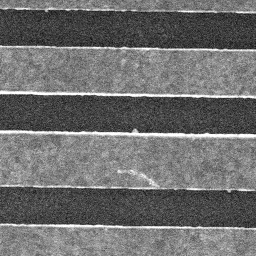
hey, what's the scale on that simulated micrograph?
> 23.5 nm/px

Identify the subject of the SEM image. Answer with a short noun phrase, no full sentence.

lines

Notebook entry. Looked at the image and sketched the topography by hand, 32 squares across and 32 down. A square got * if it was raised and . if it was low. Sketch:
********************************
.............................***
................................
................................
................................
................................
********************************
********************************
********************************
********************************
********************************
********************************
................................
................................
................................
................................
***.............................
********************************
********************************
********************************
********************************
********************************
********************************
................****************
................................
................................
................................
................................
*************************.......
********************************
********************************
********************************